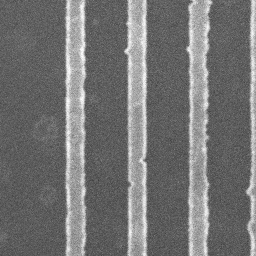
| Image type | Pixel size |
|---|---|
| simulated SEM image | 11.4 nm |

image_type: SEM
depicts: one or a few lines or trenches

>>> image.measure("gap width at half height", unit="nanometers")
527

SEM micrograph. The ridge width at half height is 179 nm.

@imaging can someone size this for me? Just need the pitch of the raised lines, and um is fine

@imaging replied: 0.704